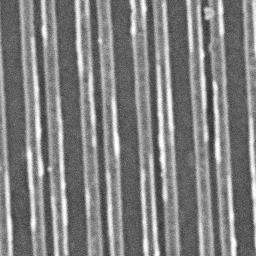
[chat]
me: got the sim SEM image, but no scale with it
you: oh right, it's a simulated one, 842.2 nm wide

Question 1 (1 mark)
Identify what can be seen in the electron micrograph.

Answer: parallel lines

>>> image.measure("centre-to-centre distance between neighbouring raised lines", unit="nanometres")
88.6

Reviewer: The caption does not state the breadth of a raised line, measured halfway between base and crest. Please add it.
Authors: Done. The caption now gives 41.1 nm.